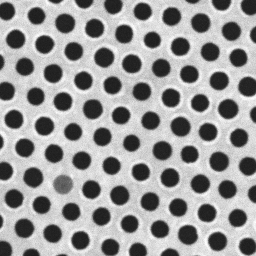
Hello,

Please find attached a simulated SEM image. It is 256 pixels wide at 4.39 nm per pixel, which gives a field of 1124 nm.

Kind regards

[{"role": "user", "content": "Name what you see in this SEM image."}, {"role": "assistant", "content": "a regular array of holes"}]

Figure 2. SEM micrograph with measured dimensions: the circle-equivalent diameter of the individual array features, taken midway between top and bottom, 81.9 nm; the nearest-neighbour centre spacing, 0.126 µm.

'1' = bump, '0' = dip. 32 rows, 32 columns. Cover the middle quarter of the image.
11111111100111100001110000111100
11111111111111100001110000011000
11100011111111111111111000111000
11100001111000111111111111111000
11100001110000111111111111111100
11100001110000111100011111111111
11110111110000111000001110001111
01111111111001111000001110000111
00111111111111111100011100000111
00111000011111111111111110000111
00111000001111111111111111001111
01111000001100001111111111111111
11111000011100000111000111111111
11111100111100001111000011110011
11111111111110001110000011100001
10001111111111111111000011100000
00001111000111111111111111100000
00000110000011111111111111110001
10001110000011100001111111111111
11111111000011100001111100111111
11111111101111100001110000011100
11111111111111110011110000011000
11100011111111111111110000011000
11000001111001111111111000111000
11000001110000111111111111111100
11100011110000111000011111111111
11111111110000111000011110001111
11111111111001111000011100000111
11111111111111111000011100000111
11111000111111111111111100000111
01111000011110011111111110001111
01110000011100001111111111111111